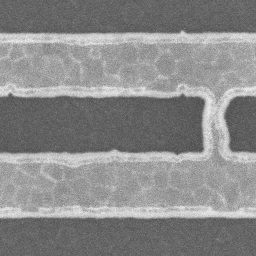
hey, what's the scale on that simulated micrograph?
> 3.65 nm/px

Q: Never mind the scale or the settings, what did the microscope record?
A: one or a few lines or trenches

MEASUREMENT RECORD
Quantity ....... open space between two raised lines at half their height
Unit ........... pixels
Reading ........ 59.7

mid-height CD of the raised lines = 218 nanometres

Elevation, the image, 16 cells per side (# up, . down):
................
................
################
################
################
################
.............#..
.............#..
.............#..
.............##.
################
################
################
................
................
................